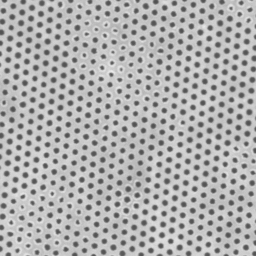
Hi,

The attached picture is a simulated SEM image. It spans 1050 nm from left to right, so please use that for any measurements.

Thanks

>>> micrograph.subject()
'a regular array of holes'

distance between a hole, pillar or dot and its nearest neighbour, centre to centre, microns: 0.0432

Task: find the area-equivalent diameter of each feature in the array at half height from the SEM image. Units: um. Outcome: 0.0227